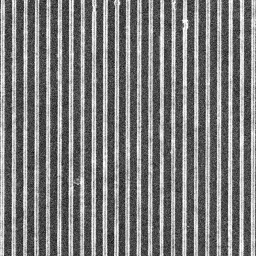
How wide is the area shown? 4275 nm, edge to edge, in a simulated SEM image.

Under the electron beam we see parallel lines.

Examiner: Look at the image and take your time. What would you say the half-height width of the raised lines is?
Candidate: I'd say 0.0438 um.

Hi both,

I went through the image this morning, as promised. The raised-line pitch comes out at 190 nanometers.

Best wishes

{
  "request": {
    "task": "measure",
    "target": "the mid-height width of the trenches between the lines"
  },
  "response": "146 nm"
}